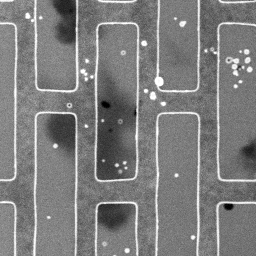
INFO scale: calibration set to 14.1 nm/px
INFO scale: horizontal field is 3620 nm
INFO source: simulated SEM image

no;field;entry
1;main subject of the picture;groups of lines, slits or small figures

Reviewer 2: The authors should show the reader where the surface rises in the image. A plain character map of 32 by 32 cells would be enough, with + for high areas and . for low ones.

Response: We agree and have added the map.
++++......++++++++++.....+++++++
++++......++++++++++.....+++++++
++++......++++++++++.....+++++++
..++......++.....+++.....++.....
..++......++.....+++.....++.....
..++......++.....+++.....++.....
..++......++.....+++.....++.....
..++......++.....+++.....++.....
..++......++.....+++.....++.....
..++......++.....+++.....++.....
..+++.....++.....+++.....++.....
..++++++++++.....++++++++++.....
..++++++++++.....++++++++++.....
..++++++++++.....++++++++++.....
..+++....+++.....+++.....++.....
..++......++.....+++.....++.....
..++......++.....+++.....++.....
..++......++.....+++.....++.....
..++......++.....+++.....++.....
..++......++.....+++.....++.....
..++......++.....+++.....++.....
..++......++.....+++.....++.....
.+++......++...+++++.....+++....
++++......++++++++++.....+++++++
++++.....+++++++++++.....+++++++
.+++.....++++....+++.....+++....
..++......++.....+++.....++.....
..++......++.....+++.....++.....
..++......++.....+++.....++.....
..++......++.....+++.....++.....
..++......++.....+++.....++.....
..++.....+++.....+++.....++.....